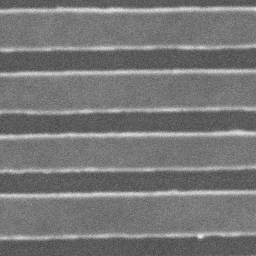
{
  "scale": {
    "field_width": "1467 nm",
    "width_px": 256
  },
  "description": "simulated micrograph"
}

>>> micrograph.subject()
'lines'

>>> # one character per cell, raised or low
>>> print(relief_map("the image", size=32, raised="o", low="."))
................................
oooooooooooooooooooooooooooooooo
oooooooooooooooooooooooooooooooo
oooooooooooooooooooooooooooooooo
oooooooooooooooooooooooooooooooo
oooooooooooooooooooooooooooooooo
................................
................................
................................
oooooooooooooooooooooooooooooooo
oooooooooooooooooooooooooooooooo
oooooooooooooooooooooooooooooooo
oooooooooooooooooooooooooooooooo
oooooooooooooooooooooooooooooooo
................................
................................
................................
oooooooooooooooooooooooooooooooo
oooooooooooooooooooooooooooooooo
oooooooooooooooooooooooooooooooo
oooooooooooooooooooooooooooooooo
ooo..oo.........................
................................
................................
oooooooooooooooooooooooooooooooo
oooooooooooooooooooooooooooooooo
oooooooooooooooooooooooooooooooo
oooooooooooooooooooooooooooooooo
oooooooooooooooooooooooooooooooo
oooooooooooooooooooooooooo......
................................
................................